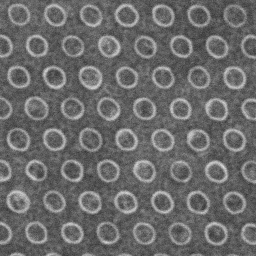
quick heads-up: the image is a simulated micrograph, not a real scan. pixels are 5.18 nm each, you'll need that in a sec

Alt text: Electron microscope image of a regular array of raised bodies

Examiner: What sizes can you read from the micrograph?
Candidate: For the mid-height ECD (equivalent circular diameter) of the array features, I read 106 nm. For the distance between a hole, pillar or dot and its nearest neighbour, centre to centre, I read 184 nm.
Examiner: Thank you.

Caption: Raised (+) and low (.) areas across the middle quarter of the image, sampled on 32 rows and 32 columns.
................................
.....+++......+++......+++......
....+++++....+++++....+++++....+
....+++++....+++++....+++++....+
.....++++.....++++.....++++.....
.....+++.......++.......++......
................................
................................
................................
++++.....++++.....++++.....++++.
+++++....++++.....+++++....++++.
+++++....+++++....+++++....+++++
++++.....++++.....+++++....++++.
..........+++......++.......+++.
................................
................................
.....++.........................
....++++.....++++......+++.....+
....+++++....+++++....+++++....+
....+++++....+++++....+++++....+
.....++++.....++++.....++++.....
......++................++......
................................
................................
+++.......++.......++........+..
++++.....++++.....++++.....++++.
++++.....+++++....++++.....+++++
++++.....+++++....+++++....+++++
.+++.....++++......+++......+++.
................................
................................
................................